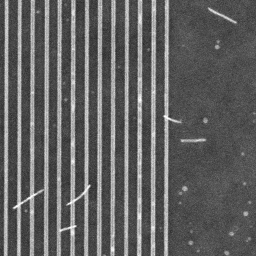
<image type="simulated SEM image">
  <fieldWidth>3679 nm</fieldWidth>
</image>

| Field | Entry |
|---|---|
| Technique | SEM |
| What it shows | parallel lines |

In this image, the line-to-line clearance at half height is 151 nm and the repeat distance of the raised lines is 192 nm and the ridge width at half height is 37.7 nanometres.